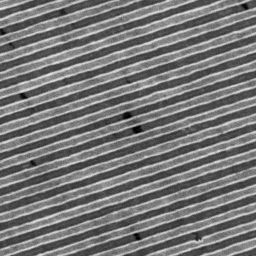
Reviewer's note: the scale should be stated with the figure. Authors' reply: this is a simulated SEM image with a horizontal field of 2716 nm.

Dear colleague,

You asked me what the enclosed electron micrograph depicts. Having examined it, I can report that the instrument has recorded parallel lines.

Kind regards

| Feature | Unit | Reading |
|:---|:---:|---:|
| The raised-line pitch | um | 0.179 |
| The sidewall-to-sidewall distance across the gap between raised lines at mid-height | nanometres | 97.3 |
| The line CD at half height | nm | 87.1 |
